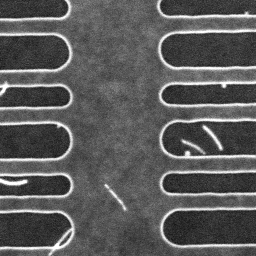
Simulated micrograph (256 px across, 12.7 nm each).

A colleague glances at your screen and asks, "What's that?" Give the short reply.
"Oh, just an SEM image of groups of lines, slits or small figures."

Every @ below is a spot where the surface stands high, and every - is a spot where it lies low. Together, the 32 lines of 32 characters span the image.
---------@@@@@@@@@@@------------
---------@@@@@@@@@@@------------
@@@@@@@@@@@@@@@@@@@@@@@@@@@@@@@@
@@@@@@@@@@@@@@@@@@@@@@@@@@@@@@@@
-------@@@@@@@@@@@@@@-----------
--------@@@@@@@@@@@@------------
---------@@@@@@@@@@@------------
---------@@@@@@@@@@@------------
-------@@@@@@@@@@@@@@@-------@-@
@@@@@@@@@@@@@@@@@@@@@@@@@@@@@@@@
@@@@@@@@@@@@@@@@@@@@@@@@@@------
---------@@@@@@@@@@@------------
---------@@@@@@@@@@@------------
-@@@-@@@@@@@@@@@@@@@@@@@@@@@@@@@
@@@@@@@@@@@@@@@@@@@@@@@@@@@@@@@@
@@-----@@@@@@@@@@@@@@-----------
---------@@@@@@@@@@@------------
---------@@@@@@@@@@@------------
---------@@@@@@@@@@@------------
--------@@@@@@@@@@@@@@----------
@@@@@@@@@@@@@@@@@@@@@@@@@@@@@@@@
@@@@@@@@@@@@@@@@@@@@@@@@@@@@@@@-
---------@@@@@@@@@@@------------
---------@@@@@@@@@@@------------
-------@@@@@@@@@@@@@@@@@@@@@@@@@
@@@@@@@@@@@@@@@@@@@@@@@@@@@@@@@@
@@---@@@@@@@@@@@@@@@@@----------
---------@@@@@@@@@@@@-----------
---------@@@@@@@@@@@------------
---------@@@@@@@@@@@------------
--------@@@@@@@@@@@@@@----------
@@@@@@@@@@@@@@@@@@@@@@@@@@@@@@@@